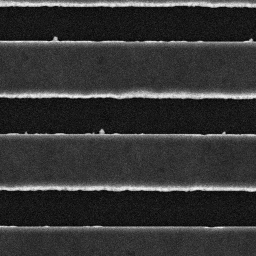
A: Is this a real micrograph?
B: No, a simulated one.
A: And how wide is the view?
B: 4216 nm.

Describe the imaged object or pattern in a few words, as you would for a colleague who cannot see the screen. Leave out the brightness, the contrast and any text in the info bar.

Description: lines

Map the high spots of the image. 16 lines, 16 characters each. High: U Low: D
DDDDDDDDDDDDDDDD
DDDDDDDDDDDDDDDD
DDDDDDDDDDDDDDDD
UUUUUUUUUUUUUUUU
UUUUUUUUUUUUUUUU
UUUUUUUUUUUUUUUU
DDDDDDDDDDDDDDDD
DDDDDDDDDDDDDDDD
UUUUUUUUUUUUUUUU
UUUUUUUUUUUUUUUU
UUUUUUUUUUUUUUUU
UUUUUUUUUUUUUUUU
DDDDDDDDDDDDDDDD
DDDDDDDDDDDDDDDD
UUUUUUUUUUUUUUUU
UUUUUUUUUUUUUUUU